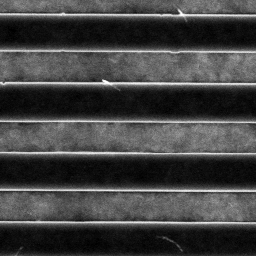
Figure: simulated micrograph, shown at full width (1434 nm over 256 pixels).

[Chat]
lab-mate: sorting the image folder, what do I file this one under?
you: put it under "one or a few lines or trenches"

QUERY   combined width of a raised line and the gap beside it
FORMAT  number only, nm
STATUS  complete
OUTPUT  388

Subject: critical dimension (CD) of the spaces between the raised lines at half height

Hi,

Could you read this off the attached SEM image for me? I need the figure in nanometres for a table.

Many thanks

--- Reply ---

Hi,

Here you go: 174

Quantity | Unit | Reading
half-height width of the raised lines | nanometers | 215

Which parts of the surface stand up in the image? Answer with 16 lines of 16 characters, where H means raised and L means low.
LLLLLLLLLLLLLLLL
HHHHHHHHHHHHHHHH
HHHHHHHHHHHHHHHH
LLLLLLLLLLLLLLLL
LLLLLLLLLLLLLLLL
HHHHHHHHHHHHHHHH
HHHHHHHHHHHHHHHH
HHHHHHHHHHHHHHHH
LLLLLLLLLLLLLLLL
LLLLLLLLLLLLLLLL
HHHHHHHHHHHHHHHH
HHHHHHHHHHHHHHHH
LLLLLLLLLLLLLLLL
LLLLLLLLLLLLLLLL
HHHHHHHHHHHHHHHH
HHHHHHHHHHHHHHHH